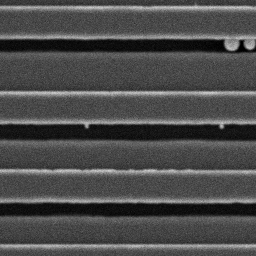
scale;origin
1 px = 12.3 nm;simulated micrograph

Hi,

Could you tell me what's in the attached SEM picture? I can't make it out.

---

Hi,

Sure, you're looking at lines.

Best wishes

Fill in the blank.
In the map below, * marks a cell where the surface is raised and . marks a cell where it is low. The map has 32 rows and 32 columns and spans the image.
********************************
********************************
********************************
********************************
********************************
............................**.*
............................**.*
********************************
********************************
********************************
********************************
********************************
********************************
********************************
********************************
..........**...............*....
................................
................................
********************************
********************************
********************************
********************************
********************************
********************************
********************************
................................
................................
********************************
********************************
********************************
********************************
********************************